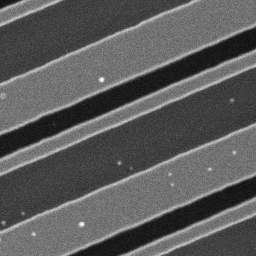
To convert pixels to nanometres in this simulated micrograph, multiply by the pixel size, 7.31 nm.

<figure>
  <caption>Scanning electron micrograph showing lines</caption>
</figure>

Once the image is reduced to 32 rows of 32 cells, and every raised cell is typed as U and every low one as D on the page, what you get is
DDUUUUUDDDDDDDDDDDDDDDDUUUUUUUUU
UUUUDDDDDDDDDDDDDDDDDUUUUUUUUUUU
UUDDDDDDDDDDDDDDDDDUUUUUUUUUUUUU
DDDDDDDDDDDDDDDDUUUUUUUUUUUUUUUD
DDDDDDDDDDDDDDUUUUUUUUUUUUUUUDDD
DDDDDDDDDDDDUUUUUUUUUUUUUUUDDDDD
DDDDDDDDDUUUUUUUUUUUUUUUDDDDDDDU
DDDDDDDUUUUUUUUUUUUUUUDDDDDDDUUU
DDDDDUUUUUUUUUUUUUUUDDDDDDDUUUUD
DDUUUUUUUUUUUUUUUDDDDDDDUUUUUDDD
UUUUUUUUUUUUUUUDDDDDDDUUUUUDDDDD
UUUUUUUUUUUUDDDDDDDDUUUUDDDDDDDD
UUUUUUUUUUDDDDDDDUUUUUDDDDDDDDDD
UUUUUUUUDDDDDDDUUUUUDDDDDDDDDDDD
UUUUUDDDDDDDDUUUUDDDDDDDDDDDDDDD
UUUDDDDDDDUUUUUDDDDDDDDDDDDDDDDD
UDDDDDDDUUUUUDDDDDDDDDDDDDDDDUUU
DDDDDUUUUUDDDDDDDDDDDDDDDDDUUUUU
DDDUUUUUDDDDDDDDDDDDDDDDDUUUUUUU
DUUUUUDDDDDDDDDDDDDDDDUUUUUUUUUU
UUUDDDDDDDDDDDDDDDDDUUUUUUUUUUUU
UDDDDDDDDDDDDDDDDDUUUUUUUUUUUUUU
DDDDDDDDDDDDDDDUUUUUUUUUUUUUUUDD
DDDDDDDDDDDDDUUUUUUUUUUUUUUUDDDD
DDDDDDDDDDDUUUUUUUUUUUUUUDDDDDDD
DDDDDDDDUUUUUUUUUUUUUUUDDDDDDDUU
DDDDDDUUUUUUUUUUUUUUUDDDDDDDUUUU
DDDUUUUUUUUUUUUUUUUDDDDDDDUUUUDD
DUUUUUUUUUUUUUUUDDDDDDDUUUUUDDDD
UUUUUUUUUUUUUUDDDDDDDUUUUUDDDDDD
UUUUUUUUUUUUDDDDDDDUUUUDDDDDDDDD
UUUUUUUUUDDDDDDDDUUUUDDDDDDDDDDD